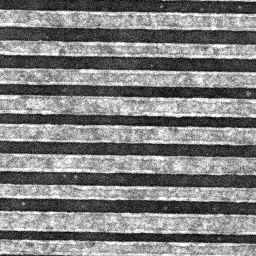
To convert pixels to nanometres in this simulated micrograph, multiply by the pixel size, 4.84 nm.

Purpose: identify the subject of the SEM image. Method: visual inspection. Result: parallel lines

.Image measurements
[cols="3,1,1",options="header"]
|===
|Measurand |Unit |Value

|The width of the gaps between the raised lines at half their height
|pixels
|13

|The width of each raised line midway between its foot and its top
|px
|16.2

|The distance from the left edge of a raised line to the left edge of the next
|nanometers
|140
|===